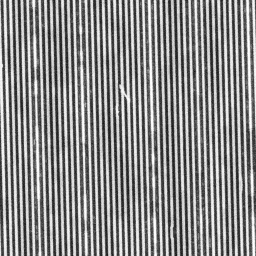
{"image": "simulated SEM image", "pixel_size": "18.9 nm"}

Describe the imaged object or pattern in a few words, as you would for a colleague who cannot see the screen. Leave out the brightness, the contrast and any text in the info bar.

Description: parallel lines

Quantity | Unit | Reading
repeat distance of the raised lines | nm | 110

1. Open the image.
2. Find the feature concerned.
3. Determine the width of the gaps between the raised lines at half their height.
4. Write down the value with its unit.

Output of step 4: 61.6 nm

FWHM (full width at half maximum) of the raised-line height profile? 45 nm